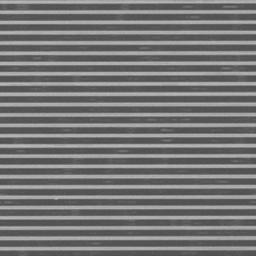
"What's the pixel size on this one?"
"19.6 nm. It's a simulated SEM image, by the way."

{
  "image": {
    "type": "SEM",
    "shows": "parallel lines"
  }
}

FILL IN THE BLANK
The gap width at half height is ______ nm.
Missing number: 150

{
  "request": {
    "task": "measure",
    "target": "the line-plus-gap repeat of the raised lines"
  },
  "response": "202 nm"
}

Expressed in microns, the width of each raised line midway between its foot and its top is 0.0565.